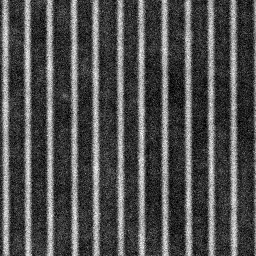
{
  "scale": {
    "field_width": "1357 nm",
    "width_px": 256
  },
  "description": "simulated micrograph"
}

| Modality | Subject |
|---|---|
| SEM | parallel lines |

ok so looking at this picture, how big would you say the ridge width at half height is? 23.2 nm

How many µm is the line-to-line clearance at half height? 0.0983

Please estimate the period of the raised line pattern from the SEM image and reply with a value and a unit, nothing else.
22.8 px